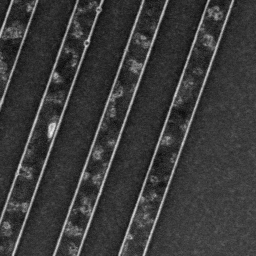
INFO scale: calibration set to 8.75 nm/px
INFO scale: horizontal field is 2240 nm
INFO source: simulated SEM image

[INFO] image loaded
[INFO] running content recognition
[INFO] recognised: parallel lines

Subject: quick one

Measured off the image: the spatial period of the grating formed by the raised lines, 540 nanometres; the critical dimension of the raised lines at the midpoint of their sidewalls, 200 nm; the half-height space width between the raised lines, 343 nm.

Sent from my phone